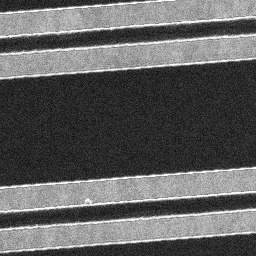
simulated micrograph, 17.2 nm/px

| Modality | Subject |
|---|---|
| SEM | lines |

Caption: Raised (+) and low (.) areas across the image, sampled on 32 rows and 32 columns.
++++++++++++++++................
+++.............................
..........................++++++
..............++++++++++++++++++
.++++++++++++++++++++++++++++...
+++++++++++++++++...............
++++............................
.............................+++
.................+++++++++++++++
....++++++++++++++++++++++++++++
++++++++++++++++++++++++++++++++
++++++++++++++++++++++++++++++++
++++++++++++++++++++++++++++++++
++++++++++++++++++++++++++++++++
++++++++++++++++++++++++++++++++
++++++++++++++++++++++++++++++++
++++++++++++++++++++++++++++++++
++++++++++++++++++++++++++++++++
++++++++++++++++++++++++++++++++
++++++++++++++++++++++++++++++++
++++++++++++++++++++++++++++++++
++++++++++++++++++++++++++......
+++++++++++++...................
+...............................
........................++++++++
............++++++++++++++++++++
++++++++++++++++++++++++++++....
++++++++++++++++................
+++.............................
..........................++++++
.............+++++++++++++++++++
++++++++++++++++++++++++++++++++